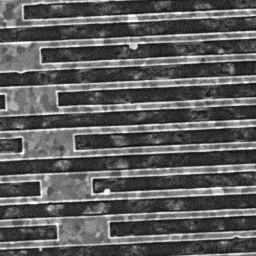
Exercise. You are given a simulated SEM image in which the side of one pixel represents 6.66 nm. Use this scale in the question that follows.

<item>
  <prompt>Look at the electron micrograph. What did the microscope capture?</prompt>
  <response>parallel lines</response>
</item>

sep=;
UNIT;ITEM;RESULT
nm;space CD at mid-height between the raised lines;106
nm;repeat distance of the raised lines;148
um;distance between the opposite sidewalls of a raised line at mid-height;0.0416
